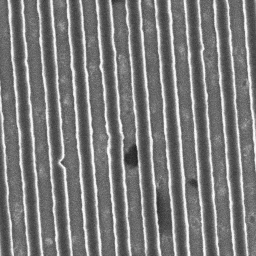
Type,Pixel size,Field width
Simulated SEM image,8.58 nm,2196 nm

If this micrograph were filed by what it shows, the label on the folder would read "parallel lines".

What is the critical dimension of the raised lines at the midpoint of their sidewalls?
13.6 pixels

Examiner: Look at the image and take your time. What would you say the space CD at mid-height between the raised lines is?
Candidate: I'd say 133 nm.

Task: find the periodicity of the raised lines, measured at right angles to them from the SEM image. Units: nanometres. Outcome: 251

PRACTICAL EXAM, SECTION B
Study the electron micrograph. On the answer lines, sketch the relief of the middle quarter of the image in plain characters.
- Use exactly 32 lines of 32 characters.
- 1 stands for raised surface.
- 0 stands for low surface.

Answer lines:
00111000011110000111000011100000
00111100011110000111000011110000
00111100001110000111000011110000
00111100001110000111000011110000
00111100001110000111100011110000
00111100001110000111000001110000
00011100001110000111100001110000
00011100001111000111100001110000
00011100001111000111100001110000
00011100001110000011100001110000
00011100001111000011100001110000
00011100001111000011100001110000
00011100001111000011100001110000
00011110000111000011100001111000
00011110000111000011100001111000
00011110000111000011100001111000
00011110000111000011110001111000
00011110000111100011110001111000
00011110000111100011110000111000
00001110000111000011110000111000
00001110000111100011110000111000
00001110000111000011110000111000
00001110000111100001110000111000
00001110000111100001110000111000
00001110000111100001110000111000
00001110000011100001110000111000
00001111000011100001110000111100
00001110000111100001110000111100
00001111000011100001110000011100
00001111000011100001110000111100
10001111000011100001111000111100
10000111000011100001111000011100